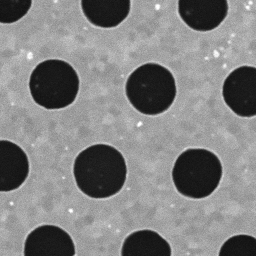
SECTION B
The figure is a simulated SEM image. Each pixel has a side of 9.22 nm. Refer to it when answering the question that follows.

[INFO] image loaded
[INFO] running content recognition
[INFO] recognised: holes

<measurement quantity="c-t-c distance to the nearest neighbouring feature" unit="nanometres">888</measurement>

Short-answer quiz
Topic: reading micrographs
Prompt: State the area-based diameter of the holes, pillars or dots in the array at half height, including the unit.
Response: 466 nm